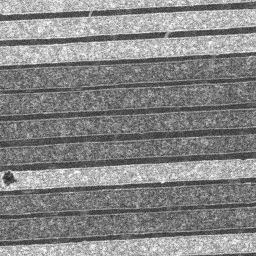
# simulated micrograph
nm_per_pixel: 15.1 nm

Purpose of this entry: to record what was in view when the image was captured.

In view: parallel lines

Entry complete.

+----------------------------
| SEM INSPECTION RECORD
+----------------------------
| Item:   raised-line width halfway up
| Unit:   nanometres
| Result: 283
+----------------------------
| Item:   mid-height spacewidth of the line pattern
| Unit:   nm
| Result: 85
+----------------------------